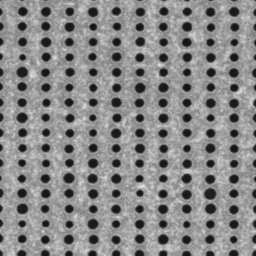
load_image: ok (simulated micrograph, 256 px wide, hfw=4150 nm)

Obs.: a regular array of holes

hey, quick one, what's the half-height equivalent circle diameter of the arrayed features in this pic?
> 0.152 µm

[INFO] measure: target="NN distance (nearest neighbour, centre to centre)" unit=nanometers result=243